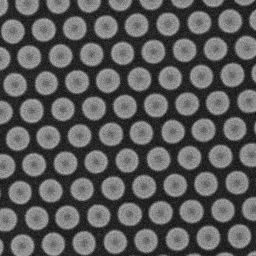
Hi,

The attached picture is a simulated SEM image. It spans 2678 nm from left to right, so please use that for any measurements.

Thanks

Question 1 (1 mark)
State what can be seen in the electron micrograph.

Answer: an array of small figures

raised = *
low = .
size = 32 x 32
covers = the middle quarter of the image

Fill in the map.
................................
..........**.....***.....***....
.****....****...*****...*****...
.*****..******..******..*****...
******..******..******..*****...
.*****...****....****....****...
.****....***......**............
..............................**
.......**....****....****...****
**...*****...*****..******..****
**...*****...*****..******..****
**...*****...*****..******..****
**...*****...****....****.....**
*.....***.......................
..................**......**....
...**.....****...****....*****..
..****...*****...*****...*****..
.******..******..*****...*****..
.******..*****...*****...****...
.*****....****....***.....**....
...**...........................
...............**.....***....***
**....****....****...*****...***
***...*****..*****...*****...***
***..******..*****...*****...***
***..******..*****...*****....**
***...****....***......*........
*...............................
...........***....****....****..
...****...*****..******..*****..
..*****...*****..******..******.
..*****...*****..******..*****..